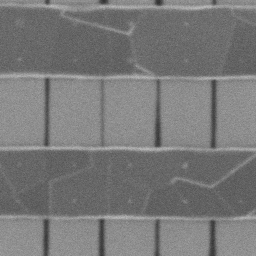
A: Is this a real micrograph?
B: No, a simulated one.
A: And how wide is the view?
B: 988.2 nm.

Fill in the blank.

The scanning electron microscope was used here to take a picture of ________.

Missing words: wiring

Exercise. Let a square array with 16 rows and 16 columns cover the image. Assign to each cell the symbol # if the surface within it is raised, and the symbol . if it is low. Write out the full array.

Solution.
####..##....####
################
################
################
################
................
................
................
................
################
################
################
################
################
................
................